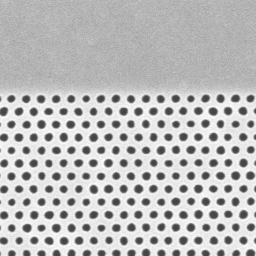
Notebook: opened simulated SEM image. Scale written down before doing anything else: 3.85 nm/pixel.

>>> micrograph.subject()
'a regular array of holes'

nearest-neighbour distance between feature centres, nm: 55.8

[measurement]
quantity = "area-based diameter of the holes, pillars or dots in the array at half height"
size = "31.6 nm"